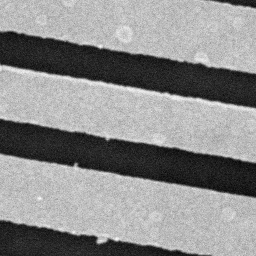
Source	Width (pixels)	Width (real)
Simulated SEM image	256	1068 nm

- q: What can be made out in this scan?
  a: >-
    lines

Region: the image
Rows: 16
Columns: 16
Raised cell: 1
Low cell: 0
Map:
1111111111111111
1111111111111111
0000111111111111
0000000000111111
1100000000000000
1111111100000000
1111111111111100
0111111111111111
0000001111111111
0000000000001111
1111100000000000
1111111111100000
1111111111111111
1111111111111111
0000111111111111
0000000000111111